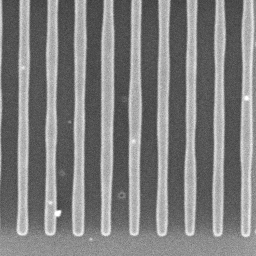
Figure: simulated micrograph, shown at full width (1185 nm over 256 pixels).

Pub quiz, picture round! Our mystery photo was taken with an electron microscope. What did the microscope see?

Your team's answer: groups of lines, slits or small figures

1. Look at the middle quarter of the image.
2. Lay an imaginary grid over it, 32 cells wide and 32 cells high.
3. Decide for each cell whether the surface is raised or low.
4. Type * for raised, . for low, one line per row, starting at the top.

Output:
...**....***.....**.....**.....*
...**....***.....**.....**.....*
...**....***.....**.....**.....*
...**....***.....**.....**.....*
...**....***.....**.....**.....*
...**....***.....**.....**.....*
...**....***.....**.....**.....*
...**....***.....**.....**.....*
...**....***....***.....**.....*
...**....***....***.....**.....*
...**....***....***.....**.....*
...**....***....***.....**.....*
...**....***....***.....**.....*
...**....***....***.....**.....*
...**....***.....**.....**.....*
...**....***.....**....***.....*
...**....***.....**....***.....*
...**....***.....**.....**.....*
...**....***.....**.....**.....*
...**....***.....**.....**.....*
...**....***.....**.....**.....*
...**....***.....**.....**.....*
...**....***.....**.....**....**
...**....***.....**.....**....**
...**....***.....**.....**....**
...**....***.....**.....**....**
...**....***.....**.....**....**
...**....***.....**.....**....**
...**....***.....**.....**....**
...**....***.....**.....**....**
..***....***.....**.....**....**
..***....***.....**.....**....**